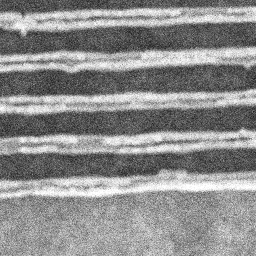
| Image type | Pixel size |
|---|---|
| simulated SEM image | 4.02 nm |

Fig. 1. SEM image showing parallel lines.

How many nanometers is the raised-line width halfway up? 57.7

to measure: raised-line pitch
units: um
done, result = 0.167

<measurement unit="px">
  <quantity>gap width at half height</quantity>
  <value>27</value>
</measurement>